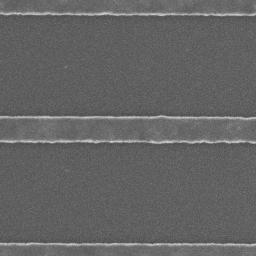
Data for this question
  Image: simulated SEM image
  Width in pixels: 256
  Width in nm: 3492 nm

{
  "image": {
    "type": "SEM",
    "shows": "one or a few lines or trenches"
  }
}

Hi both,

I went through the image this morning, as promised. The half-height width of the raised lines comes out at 341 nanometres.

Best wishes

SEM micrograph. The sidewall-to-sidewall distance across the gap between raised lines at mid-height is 1400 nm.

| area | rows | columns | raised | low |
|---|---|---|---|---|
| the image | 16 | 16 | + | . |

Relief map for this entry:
++++++++++++++++
................
................
................
................
................
................
++++++++++++++++
++++++++++++++++
................
................
................
................
................
................
++++++++++++++++